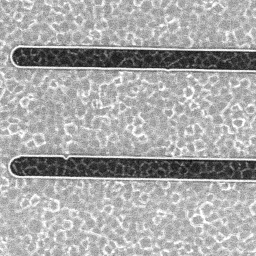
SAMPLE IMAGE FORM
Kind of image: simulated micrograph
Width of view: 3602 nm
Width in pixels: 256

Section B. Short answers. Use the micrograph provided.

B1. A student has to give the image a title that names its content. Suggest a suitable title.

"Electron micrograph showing one or a few lines or trenches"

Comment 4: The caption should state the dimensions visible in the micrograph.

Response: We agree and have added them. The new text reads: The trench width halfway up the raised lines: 1250 nanometres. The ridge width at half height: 0.285 um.